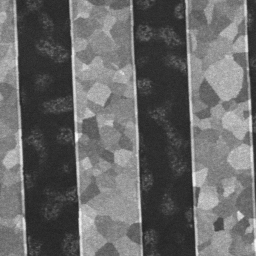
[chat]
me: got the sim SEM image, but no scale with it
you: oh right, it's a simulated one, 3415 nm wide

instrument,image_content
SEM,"one or a few lines or trenches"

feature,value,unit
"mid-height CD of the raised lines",797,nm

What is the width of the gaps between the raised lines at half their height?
741 nm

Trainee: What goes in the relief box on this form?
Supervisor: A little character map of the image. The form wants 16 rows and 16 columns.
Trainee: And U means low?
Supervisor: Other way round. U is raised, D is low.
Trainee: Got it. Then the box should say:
UDDDUUUUDDDDUUUD
UDDDUUUUDDDDUUUD
UDDDDUUUDDDDUUUD
UDDDDUUUDDDDUUUD
UDDDDUUUDDDDUUUD
UDDDDUUUDDDDUUUU
UDDDDUUUDDDDUUUU
UDDDDUUUDDDDUUUU
UDDDDUUUUDDDUUUU
UDDDDUUUUDDDUUUU
UDDDDUUUUDDDUUUU
UDDDDUUUUDDDUUUU
UDDDDUUUUDDDUUUU
UDDDDUUUUDDDUUUU
UUDDDUUUUDDDUUUU
UUDDDUUUUDDDUUUU